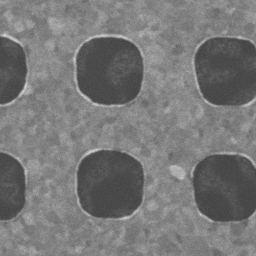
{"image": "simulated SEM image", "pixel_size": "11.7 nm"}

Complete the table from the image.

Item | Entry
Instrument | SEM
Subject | holes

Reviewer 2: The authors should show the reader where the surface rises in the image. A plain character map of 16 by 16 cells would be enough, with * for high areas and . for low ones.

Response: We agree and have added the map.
****************
****************
.*****..*****..*
..***....***....
..***....***....
..***....***....
******..*****..*
****************
****************
******..********
.****....***....
..***....***....
..***....***....
.*****..*****...
****************
****************